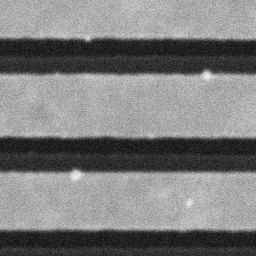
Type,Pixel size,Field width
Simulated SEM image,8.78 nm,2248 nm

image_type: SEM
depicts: lines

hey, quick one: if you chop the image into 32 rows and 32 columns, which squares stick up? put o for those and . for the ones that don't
oooooooooooooooooooooooooooooooo
oooooooooooooooooooooooooooooooo
oooooooooooooooooooooooooooooooo
oooooooooooooooooooooooooooooooo
oooooooooooooooooooooooooooooooo
................................
................................
................................
................................
oooo.oooooooooooooooooo.oooooooo
oooooooooooooooooooooooooooooooo
oooooooooooooooooooooooooooooooo
oooooooooooooooooooooooooooooooo
oooooooooooooooooooooooooooooooo
oooooooooooooooooooooooooooooooo
oooooooooooooooooooooooooooooooo
oooooooooooooooooooooooooooooooo
................................
................................
................................
................................
.........o......................
oooooooooooooooooooooooooooooooo
oooooooooooooooooooooooooooooooo
oooooooooooooooooooooooooooooooo
oooooooooooooooooooooooooooooooo
oooooooooooooooooooooooooooooooo
oooooooooooooooooooooooooooooooo
oooooooooooooooooooooooooooooooo
................................
................................
................................